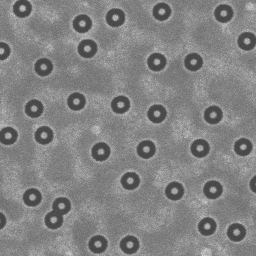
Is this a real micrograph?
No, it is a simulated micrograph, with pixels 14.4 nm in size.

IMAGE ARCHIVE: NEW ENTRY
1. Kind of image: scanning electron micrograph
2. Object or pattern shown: a regular array of ring-shaped grooves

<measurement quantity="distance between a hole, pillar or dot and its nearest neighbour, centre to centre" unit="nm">523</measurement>